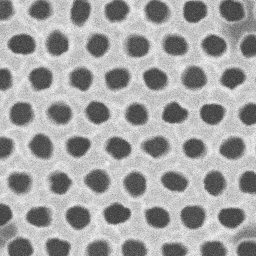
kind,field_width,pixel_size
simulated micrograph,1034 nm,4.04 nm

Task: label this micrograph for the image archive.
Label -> a regular array of holes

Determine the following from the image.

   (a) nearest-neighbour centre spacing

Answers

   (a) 152 nanometres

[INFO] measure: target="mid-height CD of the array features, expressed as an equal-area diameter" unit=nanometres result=94.9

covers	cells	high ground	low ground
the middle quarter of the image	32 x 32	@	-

@@@@@@@@@@@@@@@@@@@@@@@@@@@@@@@-
@@-----@@@@@----@@@@@---@@@@@@--
@------@@@-------@@@------@@@@--
@------@@@-------@@@------@@@---
@------@@@------@@@@------@@@---
@@-----@@@@-----@@@@-----@@@@@--
@@@@--@@@@@@-@@@@@@@@@--@@@@@@@@
@@@@@@@@@@@@@@@@@@@@@@@@@@@@@@@@
@@@@@@@@@@@@@@@@@@@@@@@@@@@@@@@@
@@@@@@@--@@@@@@@@@@@@@@@@@@-@@@@
-@@@@@-----@@@@@----@@@@@----@@@
--@@@------@@@@@-----@@@@------@
--@@@-------@@@------@@@@------@
--@@@@------@@@------@@@@------@
-@@@@@@---@@@@@@-----@@@@-----@@
@@@@@@@@@@@@@@@@@@@@@@@@@@@@@@@@
@@@@@@@@@@@@@@@@@@@@@@@@@@@@@@@@
@@@@@@@@@@@@@@@@@@@@@@@@@@@@@@@@
@@---@@@@@@@--@@@@@@@@---@@@@@@@
@-----@@@@@-----@@@@------@@@@--
------@@@@@------@@-------@@@@--
@-----@@@@@------@@@------@@@@--
@----@@@@@@@-----@@@@----@@@@@@-
@@@-@@@@@@@@---@@@@@@@@@@@@@@@@@
@@@@@@@@@@@@@@@@@@@@@@@@@@@@@@@@
@@@@@@@@@@@@@@@@@@@@@@@@@@@@@@@@
@@@@@@@---@@@@@@@@@@@@@@@@@@@@@@
-@@@@@-----@@@@@----@@@@@----@@@
-@@@@------@@@@-----@@@@------@@
--@@@------@@@@------@@@-------@
--@@@@-----@@@@------@@@@------@
-@@@@@@----@@@@@-----@@@@@----@@